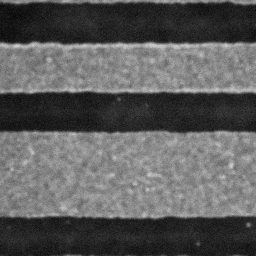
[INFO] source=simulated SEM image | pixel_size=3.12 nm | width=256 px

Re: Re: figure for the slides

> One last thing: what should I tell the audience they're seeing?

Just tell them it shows lines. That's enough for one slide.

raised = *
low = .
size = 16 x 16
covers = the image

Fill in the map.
................
................
................
****************
****************
****************
................
................
****************
****************
****************
****************
****************
***.**********..
................
................